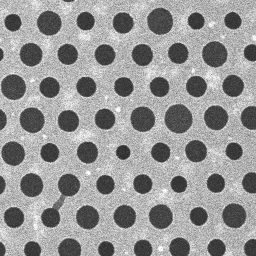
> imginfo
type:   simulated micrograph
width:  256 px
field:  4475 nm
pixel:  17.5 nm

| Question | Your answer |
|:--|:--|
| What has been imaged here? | a regular array of holes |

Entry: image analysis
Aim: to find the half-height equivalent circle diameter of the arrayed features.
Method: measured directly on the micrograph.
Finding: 372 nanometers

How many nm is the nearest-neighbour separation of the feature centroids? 635